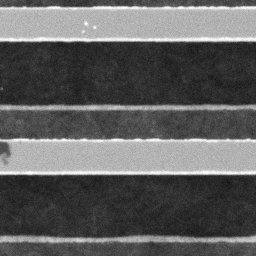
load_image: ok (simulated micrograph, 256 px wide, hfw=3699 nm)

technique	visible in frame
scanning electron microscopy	lines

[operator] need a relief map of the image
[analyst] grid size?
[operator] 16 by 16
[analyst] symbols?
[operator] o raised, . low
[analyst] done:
oooooooooooooooo
oooooooooooooooo
oooooooooooooooo
................
................
................
................
oooooooooooooooo
oooooooooooooooo
oooooooooooooooo
oooooooooooooooo
................
................
................
................
oooooooooooooooo